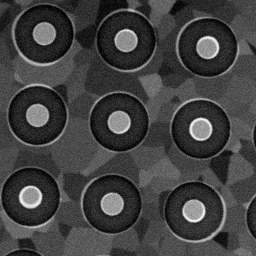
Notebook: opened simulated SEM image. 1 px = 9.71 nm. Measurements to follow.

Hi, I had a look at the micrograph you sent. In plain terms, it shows an array of small figures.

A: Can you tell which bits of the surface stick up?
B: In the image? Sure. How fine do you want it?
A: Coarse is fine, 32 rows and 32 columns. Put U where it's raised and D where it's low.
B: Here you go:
UUUUUUUUUUUUUUUUUUUUUUUUUUUUUUUU
UUUDDDDDUUUUUUDDDUUUUUUUUUUUUUUU
UUDDDDDDDUUUUDDDDDUUUUUUDDDUUUUU
UUDDUUUDDUUUDDDDDDDUUUUDDDDDDUUU
UUDDUUUDDUUUDDDUUDDUUUDDDDDDDUUU
UUDDDUDDDUUUDDUUUDDUUUDDDUUDDDUU
UUDDDDDDUUUUDDDDDDDUUUDDDUUDDDUU
UUUUDDDUUUUUUDDDDDDUUUUDDDDDDUUU
UUUUUUUUUUUUUUDDDDUUUUUDDDDDDUUU
UUUUUUUUUUUUUUUUUUUUUUUUUDDUUUUU
UUUUUUUUUUUUUUUUUUUUUUUUUUUUUUUU
UUDDDDDUUUUUUUUUUUUUUUUUUUUUUUUU
UDDDDDDDUUUUDDDDDUUUUUUUDDUUUUUU
UDDDUUDDUUUUDDDDDDUUUUDDDDDDUUUU
UDDUUUDDUUUDDDUUDDDUUUDDDDDDUUUU
UDDDUDDDUUUDDDUUDDDUUDDDUUDDDUUU
UUDDDDDDUUUDDDUDDDUUUDDDUUDDDUUU
UUUDDDDUUUUUDDDDDDUUUUDDDDDDDUUU
UUUUUUUUUUUUUDDDDUUUUUDDDDDDUUUU
UUUUUUUUUUUUUUUUUUUUUUUUDDDUUUUU
UUUUUUUUUUUUUUUUUUUUUUUUUUUUUUUU
UUDDDDUUUUUUUUUUUUUUUUUUUUUUUUUU
UDDDDDDUUUUUDDDDUUUUUUUUUUUUUUUU
DDDUDDDUUUUDDDDDDUUUUUDDDDDUUUUU
DDDUUDDDUUDDDUUDDDUUUDDDDDDUUUUU
DDDUUDDUUUDDDUUDDDUUUDDUUDDDUUUD
UDDDDDDUUUDDDUUDDDUUUDDUUDDDUUUD
UDDDDDUUUUUDDDDDDUUUUDDDUDDDUUUD
UUUUUUUUUUUUDDDDUUUUUDDDDDDUUUUD
UUUUUUUUUUUUUUUUUUUUUUDDDDUUUUUU
UUUUUUUUUUUUUUUUUUUUUUUUUUUUUUUU
UDDDDUUUUUUUUUUUUUUUUUUUUUUUUUUU